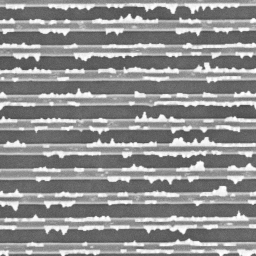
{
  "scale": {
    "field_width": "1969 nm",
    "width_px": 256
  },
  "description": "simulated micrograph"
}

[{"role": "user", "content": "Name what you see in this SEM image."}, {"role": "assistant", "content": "parallel lines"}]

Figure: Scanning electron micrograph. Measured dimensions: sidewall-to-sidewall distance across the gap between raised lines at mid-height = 105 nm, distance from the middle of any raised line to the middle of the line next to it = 190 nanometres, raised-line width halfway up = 0.0836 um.